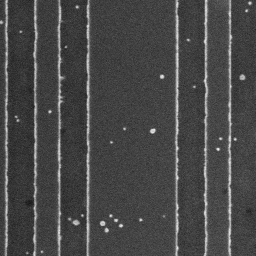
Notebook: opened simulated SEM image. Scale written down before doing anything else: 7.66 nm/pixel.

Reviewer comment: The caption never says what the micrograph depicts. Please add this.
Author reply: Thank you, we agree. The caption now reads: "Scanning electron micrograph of lines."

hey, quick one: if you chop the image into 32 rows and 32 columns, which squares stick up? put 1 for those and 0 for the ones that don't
10001111000111111111110000111000
10001111000111111111110000111000
10001111000111111111110000111000
10001110000111111111110000111000
10001110000111111111110000111000
10001110000111111111110000111000
10001110000111111111110000111000
10001111000111111111110000111000
10001110000111111111110000111000
10001110000111111111110000111000
10001110000111111111110000111000
10001110000111111111110000111000
10001110000111111111110000111000
10001110000111111111110000111000
10001110000111111111110000111000
10001110000111111111110000111000
10001110000111111111110000111000
10001110000111111111110000111000
10001110000111111111110000111000
10001110000111111111110000111000
10001110000111111111110000111000
10001110000111111111110000111000
10001110000111111111110000111000
10001110000111111111110000111000
10001110000111111111110000111000
10001110000111111111110000111000
10001110000111111111110000111000
10001110000111111111110000111000
10001110000111111111110000111000
10001110000111111111110000111000
10001110000111111111110000111000
10001110000111111111110000111000